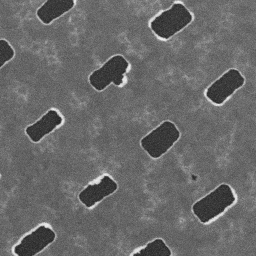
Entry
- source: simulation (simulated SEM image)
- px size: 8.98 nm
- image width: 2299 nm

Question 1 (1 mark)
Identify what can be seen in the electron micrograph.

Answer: holes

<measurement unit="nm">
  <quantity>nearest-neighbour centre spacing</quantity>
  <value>736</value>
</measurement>